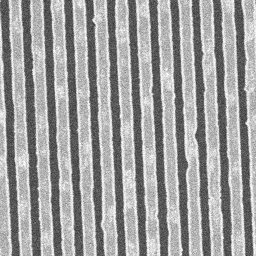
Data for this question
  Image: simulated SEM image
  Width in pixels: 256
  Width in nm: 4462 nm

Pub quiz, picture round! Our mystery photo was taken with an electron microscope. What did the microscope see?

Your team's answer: parallel lines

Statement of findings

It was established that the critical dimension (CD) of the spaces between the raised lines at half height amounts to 183 nanometers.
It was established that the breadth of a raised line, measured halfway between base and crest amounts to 0.2 µm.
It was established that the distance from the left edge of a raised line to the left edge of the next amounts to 370 nm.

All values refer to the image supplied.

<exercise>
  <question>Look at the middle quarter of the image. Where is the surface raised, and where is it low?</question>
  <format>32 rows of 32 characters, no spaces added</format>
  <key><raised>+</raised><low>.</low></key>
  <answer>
...+++..+++...++...+++..+++...++
...+++..+++...++...+++..+++...++
+..+++..+++...++...+++..+++...++
+..+++...++...++...+++..+++...++
+..+++...++...+++..+++..+++...++
+..+++...++...+++..+++..+++...++
+..+++...++...+++..+++...++...++
+..+++...++...+++...++...++...++
+..+++...++...+++..+++...++...++
+...++...++...+++..+++...++...++
+...++...++...+++...++...+++..++
+...++...++...+++...++...++...++
+...++...+++..+++...++...++...++
+...++...+++..+++...++...++...++
+...++...+++...++...++...+++..++
+...++...+++...++...++...+++..++
+...++...+++..+++...++...++...++
+...+++..+++..+++...++...+++...+
+...+++..+++...++...++...+++...+
+...+++..+++...++...++...+++...+
+...+++..+++...++...+++..+++...+
+...+++..+++...++...+++..+++...+
+...+++..+++...++...+++..+++...+
+...+++..+++...++...+++..+++...+
+...+++..+++...++...+++..+++...+
++..+++...++...++...+++..+++...+
+...+++...++...++...+++..+++...+
+...+++...++...+++..+++..+++...+
++..+++...++...+++..+++..+++...+
++..+++...++...+++..+++...++...+
++..+++...++...++...+++...++...+
++..+++...++...++....++...++...+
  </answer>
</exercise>